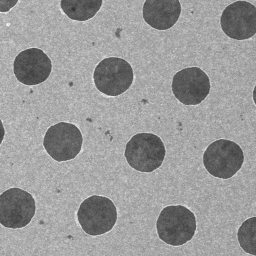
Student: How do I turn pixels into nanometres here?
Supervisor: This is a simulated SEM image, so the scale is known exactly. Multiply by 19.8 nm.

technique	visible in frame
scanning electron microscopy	a regular array of holes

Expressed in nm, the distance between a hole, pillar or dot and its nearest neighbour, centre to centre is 1560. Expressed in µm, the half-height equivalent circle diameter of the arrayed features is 0.792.